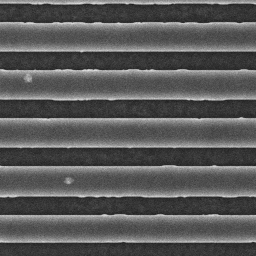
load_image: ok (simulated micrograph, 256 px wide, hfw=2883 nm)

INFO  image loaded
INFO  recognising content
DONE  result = lines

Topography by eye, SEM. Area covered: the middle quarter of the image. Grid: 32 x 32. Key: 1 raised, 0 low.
00000000000000000000000000000000
11001111100000101110111000001110
11111111111111111111111111111111
11111111111111111111111111111111
11111111111111111111111111111111
11111111111111111111111111111111
11111111111111111111111111111111
11111111111111111111111111111111
11111111111111111111111111111111
00000000000000000000000000000000
00000000000000000000000000000000
00000000000000000000000000000000
00000000000000000000000000000000
00000000000000000000000000000000
11111111111111111111111111111111
11111111111111111111111111111111
11111111111111111111111111111111
11111111111111111111111111111111
11111111111111111111111111111111
11111111111111111111111111111111
11111111111111111111111111111111
00000000000000000000000000000000
00000000000000000000000000000000
00000000000000000000000000000000
00000000000000000000000000000000
00000000000000000000000011110000
11111111111111111111111111111111
11111111111111111111111111111111
11111111111111111111111111111111
11111111111111111111111111111111
11111111111111111111111111111111
11111111111111111111111111111111